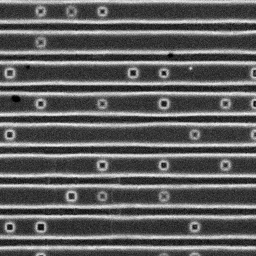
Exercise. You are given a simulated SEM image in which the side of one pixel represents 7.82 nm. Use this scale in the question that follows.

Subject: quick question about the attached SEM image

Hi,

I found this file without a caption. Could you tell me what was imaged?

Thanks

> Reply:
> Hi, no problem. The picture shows wiring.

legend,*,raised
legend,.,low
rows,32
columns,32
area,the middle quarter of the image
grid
********************************
*****************.**************
****************..******..******
********************************
********************************
................................
................................
********************************
********************************
************************..******
************************..******
********************************
**.........*********************
................................
................................
********************************
********************************
********************************
********************************
********************************
................................
................................
................................
********************************
********************************
*********.**************..******
********************************
********************************
................................
................................
**************........****..****
********************************